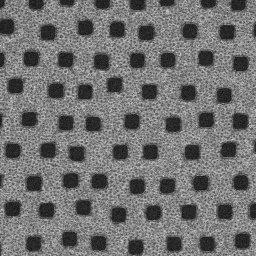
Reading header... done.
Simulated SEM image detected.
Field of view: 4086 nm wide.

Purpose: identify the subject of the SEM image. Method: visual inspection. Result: a regular array of raised bodies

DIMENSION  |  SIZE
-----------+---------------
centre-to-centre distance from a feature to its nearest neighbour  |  488 nanometres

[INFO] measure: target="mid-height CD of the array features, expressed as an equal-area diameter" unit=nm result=265